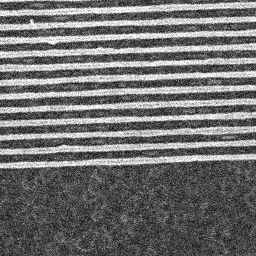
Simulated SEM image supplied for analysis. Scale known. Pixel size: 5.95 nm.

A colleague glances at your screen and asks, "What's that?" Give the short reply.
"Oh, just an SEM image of parallel lines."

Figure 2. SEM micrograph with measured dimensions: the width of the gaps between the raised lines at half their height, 50.6 nanometers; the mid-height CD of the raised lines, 28.3 nanometres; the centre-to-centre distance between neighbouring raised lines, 82.1 nanometres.